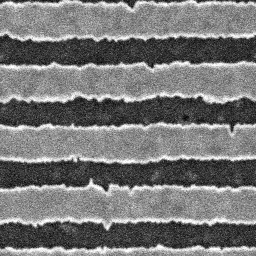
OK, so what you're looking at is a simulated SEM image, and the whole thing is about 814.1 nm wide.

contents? one or a few lines or trenches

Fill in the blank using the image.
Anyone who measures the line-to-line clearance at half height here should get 86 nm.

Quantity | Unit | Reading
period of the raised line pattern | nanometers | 196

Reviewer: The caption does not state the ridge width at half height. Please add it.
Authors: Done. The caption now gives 0.111 µm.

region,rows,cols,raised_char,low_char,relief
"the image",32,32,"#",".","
##.#############.###############
################################
################################
################################
.#####################.########.
................................
................................
................................
################################
################################
################################
################################
#.#######.......##.........##...
................................
................................
....................#...........
################################
################################
################################
################################
................................
................................
................................
...#####...#..##.######.###.#.##
################################
################################
################################
########.############.##########
................................
................................
................................
################################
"